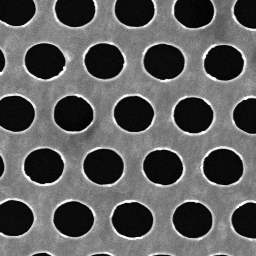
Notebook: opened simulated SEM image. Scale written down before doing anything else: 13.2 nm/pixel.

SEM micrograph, a regular array of holes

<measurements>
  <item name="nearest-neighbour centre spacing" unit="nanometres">788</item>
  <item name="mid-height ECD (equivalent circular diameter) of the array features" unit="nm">504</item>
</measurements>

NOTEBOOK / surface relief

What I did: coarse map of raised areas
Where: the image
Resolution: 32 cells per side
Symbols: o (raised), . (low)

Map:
....ooo.....oo.....ooo.....oo...
....ooo.....oo.....ooo.....oo...
....ooo....oooo....ooo....oooo..
oooooooooooooooooooooooo.oooooo.
oooooooooooooooooooooooooooooooo
ooooo.oooooo..oooooo.ooooooooooo
ooo.....ooo....ooo.....ooo....oo
.oo.....ooo....ooo.....ooo....oo
ooo.....ooo....ooo.....ooo....oo
oooo...ooooo..ooooo...oooo....oo
oooooooooooooooooooooooooooooooo
oooooooooooooooooooooooooooooooo
...ooooo...oooo...ooooo..oooooo.
....ooo....ooo.....ooo....ooo...
....ooo.....oo.....ooo.....oo...
....ooo....oooo....ooo....ooo...
ooooooooo.oooooo.oooooo..oooooo.
oooooooooooooooooooooooooooooooo
oooooooooooooooooooooooooooooooo
ooo.....ooo....ooo....oooo....oo
ooo.....oo.....ooo.....oo.....oo
ooo.....ooo....ooo.....oo.....oo
oooo...oooo....oooo...oooo....oo
oooooooooooooooooooooooooooooooo
oooooooooooooooooooooooooooooooo
...ooooo..ooooo...ooooo..oooooo.
....ooo.....oo.....ooo....ooo...
....ooo.....oo.....ooo.....oo...
....ooo....ooo.....ooo....ooo...
o.oooooo..oooooo..ooooo..ooooo..
oooooooooooooooooooooooooooooooo
oooooooooooooooooooooooooooooooo